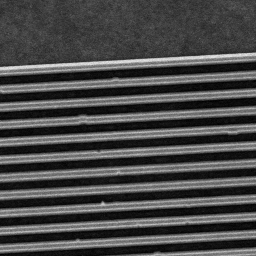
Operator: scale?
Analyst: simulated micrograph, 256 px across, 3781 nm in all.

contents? parallel lines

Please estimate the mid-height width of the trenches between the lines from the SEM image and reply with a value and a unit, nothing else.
149 nm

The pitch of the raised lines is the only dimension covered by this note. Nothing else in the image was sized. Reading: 261 nm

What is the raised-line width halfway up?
109 nanometers